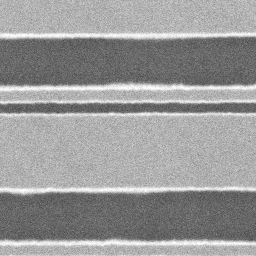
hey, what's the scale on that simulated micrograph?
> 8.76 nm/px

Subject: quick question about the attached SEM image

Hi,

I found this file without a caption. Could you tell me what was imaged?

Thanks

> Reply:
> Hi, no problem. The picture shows lines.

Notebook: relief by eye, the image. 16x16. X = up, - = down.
XXXXXXXXXXXXXXXX
XXXXXXXXXXXXXXXX
----------------
----------------
----------------
-------XX--X-XXX
XXXXXXXXXXXXXXXX
XXXXXXXXXXXXXXXX
XXXXXXXXXXXXXXXX
XXXXXXXXXXXXXXXX
XXXXXXXXXXXXXXXX
XXXXXXXXXXXXXXXX
----------------
----------------
----------------
XXXXXXXXXXXXXXXX